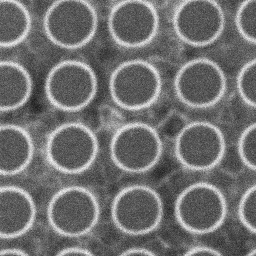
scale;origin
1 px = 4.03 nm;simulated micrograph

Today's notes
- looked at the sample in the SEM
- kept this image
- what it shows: a regular array of raised bodies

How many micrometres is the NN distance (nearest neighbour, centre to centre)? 0.252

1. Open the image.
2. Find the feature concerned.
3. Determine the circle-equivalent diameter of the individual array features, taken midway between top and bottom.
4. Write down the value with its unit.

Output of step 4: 191 nm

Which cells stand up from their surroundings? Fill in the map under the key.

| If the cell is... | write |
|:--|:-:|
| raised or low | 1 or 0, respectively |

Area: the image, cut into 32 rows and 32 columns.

11000001111000011100000111100011
11100011111100111110001111110011
11110011111100111110001111110011
11110011111100111110001111110011
11100011111000111110000111100001
10000001110000001100000000000000
00000000000000000000000000000000
00000000000000000000000000000000
11100001111000011110000111100001
11100011111100111111001111110011
11110011111100111111001111110011
11110011111100111111001111110011
11100011111000011110000111100001
11000000110000001000000000000000
00000000000000000000000000000000
00000000000000000000000011000000
11100001111000011110000111100001
11110011111100111111001111110011
11110011111100111111001111110011
11110011111100111111001111110011
11100001111000011110000111100001
11000000000000000000000000000000
00000000000000000000000000000000
00000000000000000100000011100000
11100001111000011111000111110001
11110011111100111111001111110011
11110011111100111111001111110011
11110011111100111111000111110011
11100001111000011110000111100001
00000000000000000000000000000000
00000000000000000000000000000000
01000000111000001100000011100000